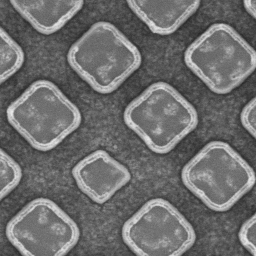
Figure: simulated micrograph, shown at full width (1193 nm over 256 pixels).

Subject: raised bodies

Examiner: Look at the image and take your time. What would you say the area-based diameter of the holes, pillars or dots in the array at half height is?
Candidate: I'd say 0.295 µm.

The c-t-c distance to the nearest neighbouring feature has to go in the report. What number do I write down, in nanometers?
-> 385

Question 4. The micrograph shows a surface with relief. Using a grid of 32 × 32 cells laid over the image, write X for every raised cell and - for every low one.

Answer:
--XXXXXXXX------XXXXXXXXX------X
---XXXXXX--------XXXXXXX-------X
----XXXX----------XXXXX---------
-----XX-----XX-----XXX----XXX---
X----------XXXX----------XXXXX--
XX-------XXXXXXX--------XXXXXXX-
XXX------XXXXXXXX------XXXXXXXXX
XXX------XXXXXXXX------XXXXXXXXX
XX-------XXXXXXXX-------XXXXXXXX
X---------XXXXXX---------XXXXXX-
----XX-----XXXX-----------XXXX--
---XXXX-----------XXXX----------
--XXXXXX---------XXXXXX---------
-XXXXXXXX-------XXXXXXXX-------X
-XXXXXXXXX------XXXXXXXX------XX
--XXXXXXXX------XXXXXXXX------XX
--XXXXXXX--------XXXXXX--------X
----XXXX----------XXXX----------
-----X-------------XX-----XXX---
X----------XX------------XXXXX--
XX--------XXXXX---------XXXXXXX-
XX-------XXXXXXX-------XXXXXXXX-
XX--------XXXXXX-------XXXXXXXXX
X---------XXXXX---------XXXXXXX-
-----------XXX-----------XXXXX--
----XXX-----------XXX-----XXX---
---XXXXX---------XXXXX----------
--XXXXXXX-------XXXXXXX--------X
-XXXXXXXXX------XXXXXXXX------XX
-XXXXXXXXX------XXXXXXXX------XX
--XXXXXXX-------XXXXXXXX-------X
---XXXXX---------XXXXXX---------